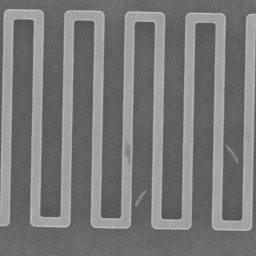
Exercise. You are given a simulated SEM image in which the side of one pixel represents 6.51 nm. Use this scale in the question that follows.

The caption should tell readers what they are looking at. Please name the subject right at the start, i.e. groups of lines, slits or small figures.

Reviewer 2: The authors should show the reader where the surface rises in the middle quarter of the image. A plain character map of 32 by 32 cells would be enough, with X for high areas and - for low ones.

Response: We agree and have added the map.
XX------XX-----XX------XX-----XX
XX-----XXX-----XX------XX-----XX
XX-----XXX-----XX------XX-----XX
XX-----XXX-----XX------XX-----XX
XX-----XXX-----XX------XX-----XX
XX-----XXX-----XX------XX-----XX
XX-----XXX-----XX------XX-----XX
XX-----XXX-----XX------XX-----XX
XX-----XXX-----XX------XX-----XX
XX-----XXX-----XX------XX-----XX
XX-----XXX-----XX------XX-----XX
XX-----XXX-----XX------XX-----XX
XX-----XXX-----XX-----XXX-----XX
XX-----XXX-----XX-----XXX-----XX
XX-----XXX-----XX-----XXX-----XX
XX-----XXX-----XX-----XXX-----XX
XX-----XXX-----XX-----XXX-----XX
XX-----XXX-----XX-----XXX-----XX
XX-----XXX-----XX-----XX------XX
XX-----XXX-----XX-----XX------XX
XX-----XX------XX-----XX------XX
XX-----XX------XX-----XX------XX
XX-----XX------XX-----XX------XX
XX-----XX------XX-----XX------XX
XX-----XX------XX-----XX------XX
XX-----XX------XX-----XX------XX
XX-----XX------XX-----XX------XX
XX-----XX------XX-----XX------XX
XX-----XX------XX-----XX------XX
XX-----XX------XX-----XX------XX
XX-----XX------XX-----XX------XX
XX-----XX-----XXX-----XX------XX